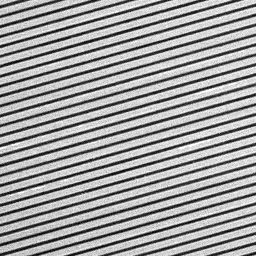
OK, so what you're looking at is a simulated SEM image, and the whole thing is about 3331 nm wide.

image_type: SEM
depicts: parallel lines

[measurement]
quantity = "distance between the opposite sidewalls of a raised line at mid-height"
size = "6.02 px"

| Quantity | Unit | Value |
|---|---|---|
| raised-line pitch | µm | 0.124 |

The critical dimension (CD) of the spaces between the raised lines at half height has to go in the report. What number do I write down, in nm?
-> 39.1